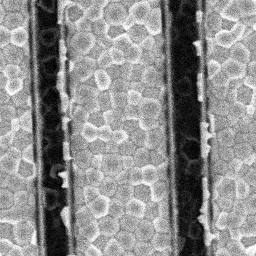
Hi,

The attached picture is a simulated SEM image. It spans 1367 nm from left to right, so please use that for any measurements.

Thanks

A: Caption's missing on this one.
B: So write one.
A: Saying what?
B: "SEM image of one or a few lines or trenches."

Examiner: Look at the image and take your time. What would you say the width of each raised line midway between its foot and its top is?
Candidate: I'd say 0.183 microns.